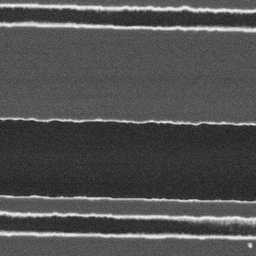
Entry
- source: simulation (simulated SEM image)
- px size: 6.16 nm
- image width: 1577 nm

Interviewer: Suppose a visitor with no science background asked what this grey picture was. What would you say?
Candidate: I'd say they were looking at lines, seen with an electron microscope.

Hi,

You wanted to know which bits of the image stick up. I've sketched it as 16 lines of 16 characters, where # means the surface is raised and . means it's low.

################
################
################
################
################
################
################
..##############
................
................
................
................
###########.....
################
################
################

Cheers